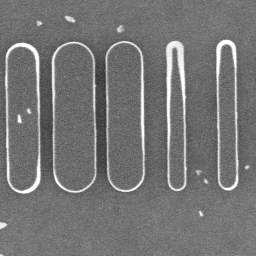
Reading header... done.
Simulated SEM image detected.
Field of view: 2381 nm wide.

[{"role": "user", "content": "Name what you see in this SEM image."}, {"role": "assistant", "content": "groups of lines, slits or small figures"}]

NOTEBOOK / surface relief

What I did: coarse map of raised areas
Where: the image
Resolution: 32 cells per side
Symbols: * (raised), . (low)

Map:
................................
................................
................................
................................
................................
........**....***...........*...
.***...****..*****...**....**...
.****..*****.*****...**....**...
.****..*****.*****...**....**...
.****..*****.*****...**....**...
.****..*****.*****...**....**...
.****..*****.*****...**....**...
.****..*****.*****...**....**...
.****..*****.*****...**....**...
.****..*****.*****...**....**...
.****..*****.*****...**....**...
.****..*****.*****...**....***..
.****..*****.*****...**....**...
.****..*****.*****...**....**...
.****..*****.*****...**....***..
.****..*****.*****...**....***..
.****..*****.*****...**....***..
.****..*****..****...**....***..
..**....***....**.....*.....*...
................................
................................
................................
................................
................................
................................
................................
................................